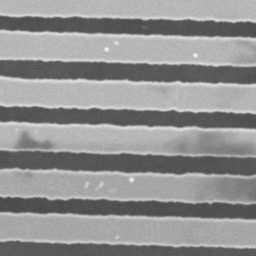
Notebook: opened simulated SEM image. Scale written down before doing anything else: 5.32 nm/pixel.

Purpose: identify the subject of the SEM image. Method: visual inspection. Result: lines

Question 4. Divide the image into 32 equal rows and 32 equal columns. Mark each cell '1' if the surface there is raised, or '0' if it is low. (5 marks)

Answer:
11111111111111111111111111111111
11111111111111111111111111111111
00000000000000000000000011111111
00000000000000000000000000000000
11111111111111111111111000000000
11111111111111111111111111111111
11111111111111111111111111111111
00111111111111111111111111111111
00000000000000000000000000000000
00000000000000000000000000000000
11111111111111111111111111111101
11111111111111111111111111111111
11111111111111111111111111111111
00000010111111111111111111111111
00000000000000000000000000000000
11111110000000000000000000000000
11111111111111111111111111111111
11111111111111111111111111111111
11111111111111111111111111111111
00000000000000000000000111111111
00000000000000000000000000000000
11111111111111100000000000000000
11111111111111111111111111111111
11111111111111111111111111111111
11111111111111111111111111111111
00000000000000000000000000000011
00000000000000000000000000000000
11111111111111111111111111111111
11111111111111111111111111111111
11111111111111111111111111111111
00000000000000111111111111111111
00000000000000000000000000000000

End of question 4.